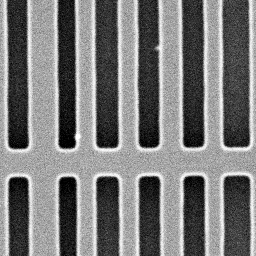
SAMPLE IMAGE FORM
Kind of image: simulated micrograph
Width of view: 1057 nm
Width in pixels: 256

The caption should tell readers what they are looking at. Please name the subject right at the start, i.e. groups of lines, slits or small figures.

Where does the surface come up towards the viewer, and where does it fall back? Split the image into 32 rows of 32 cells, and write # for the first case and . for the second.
#...###...##...##...###...##...#
#...###...##...##...###...##...#
#...###...##...##...###...##...#
#...###...##...##...###...##...#
#...###...##...##...###...##...#
#...###...##...##...###...##...#
#...###...##...##...###...##...#
#...###...##...##...###...##...#
#...###...##...##...###...##...#
#...###...##...##...###...##...#
#...###...##...##...###...##...#
#...###...##...##...###...##...#
#...###...##...##...###...##...#
#...###...##...##...###...##...#
#...###...##...##...###...##...#
#...###...##...##...###...##...#
#...###...##...##...###...##...#
#...###...##...##...###...##...#
#..#####.###..####.#####.####..#
################################
################################
################################
#..####...##...##...###...##...#
#...###...##...##...###...##...#
#...###...##...##...###...##...#
#...###...##...##...###...##...#
#...###...##...##...###...##...#
#...###...##...##...###...##...#
#...###...##...##...###...##....
#...###...##...##...###...##...#
#...###...##...##...###...##...#
#...###...##...##...###...##...#